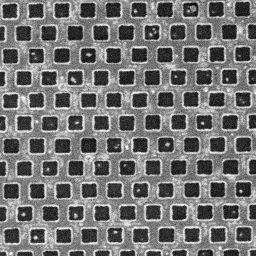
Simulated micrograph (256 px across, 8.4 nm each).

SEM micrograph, a regular array of holes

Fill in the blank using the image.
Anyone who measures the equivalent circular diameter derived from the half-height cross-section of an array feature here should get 17.5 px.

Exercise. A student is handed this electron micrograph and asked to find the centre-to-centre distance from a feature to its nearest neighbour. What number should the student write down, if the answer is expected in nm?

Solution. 213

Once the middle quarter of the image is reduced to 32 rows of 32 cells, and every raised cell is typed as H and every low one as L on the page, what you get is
HHHHHHHHHHHHHHHHHHHHHHHHHHHHHHHH
HHLLHHHHHHHHHHLLLHHHHLLLHHHLLLHH
HLLLLHHLLLLHHHLLLLHHLLLLHHLLLLLH
HLLLLHHLLLLHHHLLLLHHLLLLHHLLLLLH
HLLLLHHLLLLHHHLLLLHHLLLLHHLLLLLH
HLLLHHHHLLHHHHLLLHHHHHHHHHHHHHHH
HHHHHHHHHHHHHHHHHHHHHHHHHHHHHHHH
LHHHLLLLHHHLLLHHHLLLLHHLLLLHHHLL
LLHHLLLLHHLLLLHHHLLLLHHLLLLHHHLL
LLHHLLLLHHLLLLHHHLLLLHHLLLLLHHLL
LHHHLLLLHHLLLLHHHLLLLHHHLLLHHHLL
HHHHHHHHHHHHHHHHHHHHHHHHHHHHHHHH
HHHHHHHHHHHHHHHHHHHHHHHHHHHHHHHH
HLLLLHHLLLLHHHLLLLHHLLLLHHHLLLLH
HLLLLHHLLLLHHHLLLLHHLLLLHHHLLLLH
HLLLLHHLLLLHHHLLLLHHLLLLHHLLLLLH
HLLLHHHHLLLHHHLLLHHHHLLLHHHLLLHH
HHHHHHHHHHHHHHHHHHHHHHHHHHHHHHHH
LHHHHLLLHHHLLLHHHHLLHHHHLLLHHHLL
LLHHLLLLHHHLLLLHHLLLLHHLLLLLHHLL
LLHHLLLLHHHLLLLHHLLLLHHLLLLLHHLL
LLHHLLLLHHHLLLLHHLLLLHHLLLLLHHLL
LHHHHHHHHHHHHHHHHHLHHHHHHHHHHHHH
HHHHHHHHHHHHHHHHHHHHHHHHHHHHHHHH
HLLLLHHLLLLHHHLLLLHHLLLLHHHLLLLH
HLLLLHHLLLLHHHLLLLHHLLLLHHHLLLLH
HLLLLHHLLLLHHHLLLLHHLLLLHHHLLLLH
HLLLLHHLLLLHHHLLLLHHLLLLHHHLLLHH
HHHHHHHHHHHHHHHHHHHHHHHHHHHHHHHH
HHHHHLLHHHHHHHHHHHHHHHHHHHHHHHHH
LLHHLLLLHHHLLLLHHLLLLHHLLLLLHHLL
LLHHLLLLHHHLLLLHHLLLLHHLLLLLHHLL